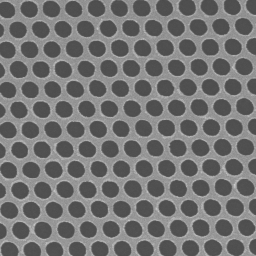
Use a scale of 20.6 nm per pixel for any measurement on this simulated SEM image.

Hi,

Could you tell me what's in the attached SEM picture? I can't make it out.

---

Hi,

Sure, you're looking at a regular array of holes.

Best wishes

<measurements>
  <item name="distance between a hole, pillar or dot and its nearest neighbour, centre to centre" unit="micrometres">0.461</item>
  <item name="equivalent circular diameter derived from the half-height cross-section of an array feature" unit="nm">357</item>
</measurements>